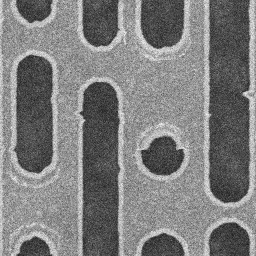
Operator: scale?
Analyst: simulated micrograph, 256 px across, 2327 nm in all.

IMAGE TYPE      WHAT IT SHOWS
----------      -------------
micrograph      one or a few lines or trenches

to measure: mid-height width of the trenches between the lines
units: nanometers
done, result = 369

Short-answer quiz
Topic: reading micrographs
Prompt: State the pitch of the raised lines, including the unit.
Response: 0.575 um